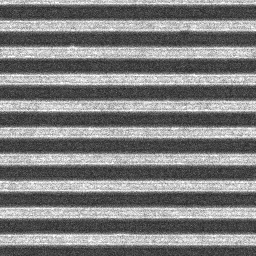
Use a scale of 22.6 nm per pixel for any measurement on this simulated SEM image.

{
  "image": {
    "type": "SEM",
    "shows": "parallel lines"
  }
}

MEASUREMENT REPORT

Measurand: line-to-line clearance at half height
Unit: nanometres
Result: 320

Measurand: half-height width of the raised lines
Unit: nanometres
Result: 277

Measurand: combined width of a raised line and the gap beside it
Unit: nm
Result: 606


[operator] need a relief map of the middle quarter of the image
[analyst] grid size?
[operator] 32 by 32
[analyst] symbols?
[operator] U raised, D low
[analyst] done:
DDDDDDDDDDDDDDDDDDDDDDDDDDDDDDDD
DDDDDDDDDDDDDDDDDDDDDDDDDDDDDDDD
UUUUUUUUUUUUUUUUUUUUUUUUUUUUUUUU
UUUUUUUUUUUUUUUUUUUUUUUUUUUUUUUU
UUUUUUUUUUUUUUUUUUUUUUUUUUUUUUUU
DDDDDDDDDDDDDDDDDDDDDDDDDDDDDDDD
DDDDDDDDDDDDDDDDDDDDDDDDDDDDDDDD
DDDDDDDDDDDDDDDDDDDDDDDDDDDDDDDD
DDDDDDDDDDDDDDDDDDDDDDDDDDDDDDDD
UUUUUUUUUUUUUUUUUUUUUUUUUUUUUUUU
UUUUUUUUUUUUUUUUUUUUUUUUUUUUUUUU
UUUUUUUUUUUUUUUUUUUUUUUUUUUUUUUU
DDDDDDDDDDDDDDDDDDDDDDDDDDDDDDDD
DDDDDDDDDDDDDDDDDDDDDDDDDDDDDDDD
DDDDDDDDDDDDDDDDDDDDDDDDDDDDDDDD
DDDDDDDDDDDDDDDDDDDDDDDDDDDDDDDD
UUUUUUUUUUUUUUUUUUUUUUUUUUUUUUUU
UUUUUUUUUUUUUUUUUUUUUUUUUUUUUUUU
UUUUUUUUUUUUUUUUUUUUUUUUUUUUUUUU
DDDDDDDDDDDDDDDDDDDDDDDDDDDDDDDD
DDDDDDDDDDDDDDDDDDDDDDDDDDDDDDDD
DDDDDDDDDDDDDDDDDDDDDDDDDDDDDDDD
UUUUUUUUUUUUUUUUUUUUUUUUUUUUUUUU
UUUUUUUUUUUUUUUUUUUUUUUUUUUUUUUU
UUUUUUUUUUUUUUUUUUUUUUUUUUUUUUUU
DDDDDDDDDDDDDDDDDDDDDDDDDDDDDDDD
DDDDDDDDDDDDDDDDDDDDDDDDDDDDDDDD
DDDDDDDDDDDDDDDDDDDDDDDDDDDDDDDD
DDDDDDDDDDDDDDDDDDDDDDDDDDDDDDDD
UUUUUUUUUUUUUUUUUUUUUUUUUUUUUUUU
UUUUUUUUUUUUUUUUUUUUUUUUUUUUUUUU
UUUUUUUUUUUUUUUUUUUUUUUUUUUUUUUU